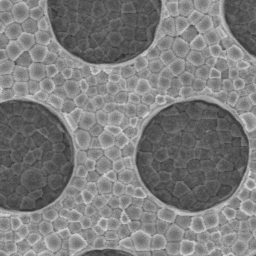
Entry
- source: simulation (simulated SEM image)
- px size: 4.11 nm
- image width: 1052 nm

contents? holes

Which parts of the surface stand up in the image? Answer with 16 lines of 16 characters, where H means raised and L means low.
HHHLLLLLLLHHHHLL
HHHLLLLLLLHHHHLL
HHHHLLLLLLHHHHHL
HHHHHLLLLHHHHHHH
HHHHHHHHHHHHHHHH
HHHHHHHHHHHHHHHH
LLLHHHHHHHHLLLHH
LLLLHHHHHLLLLLLH
LLLLHHHHHLLLLLLH
LLLLLHHHLLLLLLLL
LLLLLHHHHLLLLLLH
LLLLHHHHHLLLLLLH
LLLHHHHHHHLLLLHH
HHHHHHHHHHHHHHHH
HHHHHHHHHHHHHHHH
HHHHHHHHHHHHHHHH